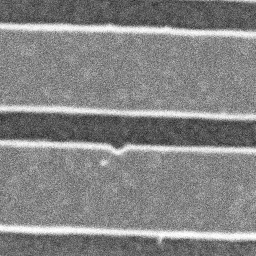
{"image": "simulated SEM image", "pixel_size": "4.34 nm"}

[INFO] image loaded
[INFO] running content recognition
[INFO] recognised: one or a few lines or trenches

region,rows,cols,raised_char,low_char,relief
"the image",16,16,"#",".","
................
................
################
################
################
################
################
................
................
################
################
################
################
################
.....###########
................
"